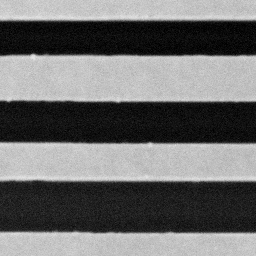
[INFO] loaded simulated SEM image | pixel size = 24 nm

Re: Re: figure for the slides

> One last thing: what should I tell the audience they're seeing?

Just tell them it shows lines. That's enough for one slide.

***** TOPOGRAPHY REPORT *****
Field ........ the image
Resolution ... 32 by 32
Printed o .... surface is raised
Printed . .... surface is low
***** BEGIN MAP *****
oooooooooooooooooooooooooooooooo
oooooooooooooooooooooooooooooooo
oooooooooooooooooooooooooooooooo
................................
................................
................................
................................
oooooooooooooooooooooooooooooooo
oooooooooooooooooooooooooooooooo
oooooooooooooooooooooooooooooooo
oooooooooooooooooooooooooooooooo
oooooooooooooooooooooooooooooooo
oo...ooooooooooooooooooooooooooo
................................
................................
................................
................................
................................
oooooooooooooooooooooooooooooooo
oooooooooooooooooooooooooooooooo
oooooooooooooooooooooooooooooooo
oooooooooooooooooooooooooooooooo
......oooooooooooooooooooooooooo
................................
................................
................................
................................
................................
................................
oooooooooooooooooooooooooooooooo
oooooooooooooooooooooooooooooooo
oooooooooooooooooooooooooooooooo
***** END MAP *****